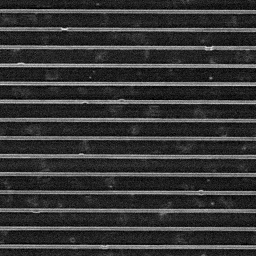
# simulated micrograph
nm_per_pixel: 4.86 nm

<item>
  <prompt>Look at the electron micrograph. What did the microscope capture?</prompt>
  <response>parallel lines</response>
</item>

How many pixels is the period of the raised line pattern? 18.1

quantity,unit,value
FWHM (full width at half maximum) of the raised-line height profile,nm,16.4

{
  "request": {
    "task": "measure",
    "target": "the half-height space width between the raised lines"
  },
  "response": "71.7 nm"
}